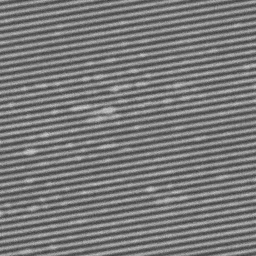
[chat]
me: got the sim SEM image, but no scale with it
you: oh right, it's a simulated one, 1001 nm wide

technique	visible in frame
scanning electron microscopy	parallel lines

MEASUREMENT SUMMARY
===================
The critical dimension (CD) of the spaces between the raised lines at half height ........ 0.0169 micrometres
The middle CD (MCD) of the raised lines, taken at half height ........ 10.1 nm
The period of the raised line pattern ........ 27.4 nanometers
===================